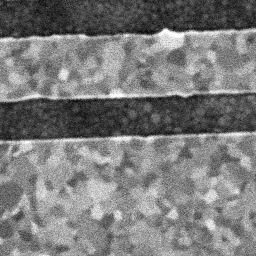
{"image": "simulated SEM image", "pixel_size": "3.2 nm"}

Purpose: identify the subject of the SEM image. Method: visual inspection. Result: one or a few lines or trenches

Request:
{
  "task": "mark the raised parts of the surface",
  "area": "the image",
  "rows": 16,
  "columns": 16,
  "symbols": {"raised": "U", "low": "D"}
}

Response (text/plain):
DDDDDDDDDDDDDDDD
DDDDDDDDDDDDDDDD
UUUUUUUUUUUUUUUU
UUUUUUUUUUUUUUUU
UUUUUUUUUUUUUUUU
UUUUUUUUUUUUUUUU
DDDDDDDDDDDDDDDD
DDDDDDDDDDDDDDDD
DDDDDDDDDDDUUUUU
UUUUUUUUUUUUUUUU
UUUUUUUUUUUUUUUU
UUUUUUUUUUUUUUUU
UUUUUUUUUUUUUUUU
UUUUUUUUUUUUUUUU
UUUUUUUUUUUUUUUU
UUUUUUUUUUUUUUUU